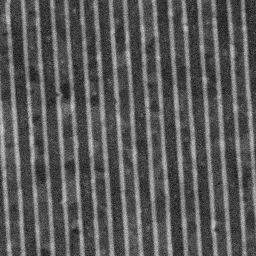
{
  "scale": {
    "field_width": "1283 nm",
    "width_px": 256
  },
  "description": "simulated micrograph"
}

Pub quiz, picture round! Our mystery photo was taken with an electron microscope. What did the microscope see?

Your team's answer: parallel lines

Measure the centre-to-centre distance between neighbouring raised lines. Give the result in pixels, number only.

29.4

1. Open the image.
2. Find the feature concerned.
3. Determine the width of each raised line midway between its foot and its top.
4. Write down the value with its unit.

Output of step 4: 73.1 nm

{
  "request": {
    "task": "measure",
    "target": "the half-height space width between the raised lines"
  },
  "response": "14.6 px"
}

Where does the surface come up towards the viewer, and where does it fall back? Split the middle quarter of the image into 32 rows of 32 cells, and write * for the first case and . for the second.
*.....***....***....****...****.
**....***....***....****...****.
**....***....***....****....***.
**....***....***....****....***.
**....***....****...****....***.
**....***....****...****....***.
**....***....****....***....***.
**....***....****....***....***.
**....***....****....***....***.
**....***.....***....***....***.
**....***....****....***....****
**....***.....***....***....****
**....****....***....***....****
**....****....***....***....****
**....****....***....***....****
***...****....***....****...****
***...****....***....****....***
***...****....***....****....***
***...****....***....****....***
***....***....***....****....***
***....***....***....****....***
***....***....****....***....***
***....***....****....***....***
***....***....****....***....***
***....****...****....***....***
***....****...****....***....***
***....****...****....***....***
***....****...****....***....***
***....****...****....***....***
***....****...****....***....***
***.....***....***....****...***
***.....***....***....****...***